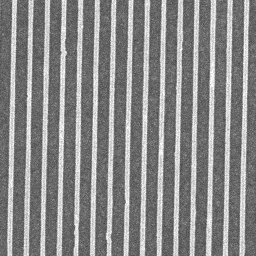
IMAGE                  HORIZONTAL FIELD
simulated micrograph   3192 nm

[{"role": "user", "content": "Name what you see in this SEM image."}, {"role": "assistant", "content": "parallel lines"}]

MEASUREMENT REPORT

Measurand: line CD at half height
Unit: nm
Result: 46.7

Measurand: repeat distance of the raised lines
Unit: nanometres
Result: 207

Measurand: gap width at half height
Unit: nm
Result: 162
